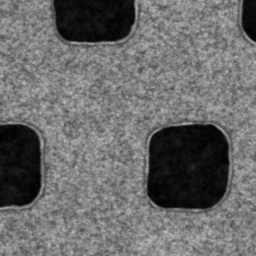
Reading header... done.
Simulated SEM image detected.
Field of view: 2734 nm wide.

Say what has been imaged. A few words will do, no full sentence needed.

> holes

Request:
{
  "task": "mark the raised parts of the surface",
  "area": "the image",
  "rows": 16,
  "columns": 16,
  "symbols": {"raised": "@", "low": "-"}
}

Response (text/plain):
@@@-----@@@@@@@-
@@@-----@@@@@@@-
@@@@----@@@@@@@@
@@@@@@@@@@@@@@@@
@@@@@@@@@@@@@@@@
@@@@@@@@@@@@@@@@
@@@@@@@@@@@@@@@@
@@@@@@@@@@@@@@@@
--@@@@@@@@----@@
---@@@@@@-----@@
---@@@@@@-----@@
---@@@@@@-----@@
--@@@@@@@-----@@
@@@@@@@@@@@@@@@@
@@@@@@@@@@@@@@@@
@@@@@@@@@@@@@@@@